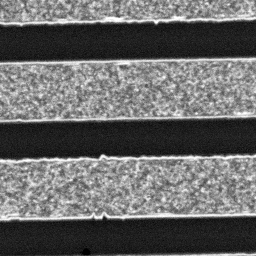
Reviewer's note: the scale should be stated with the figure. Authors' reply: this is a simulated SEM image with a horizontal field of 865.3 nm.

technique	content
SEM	one or a few lines or trenches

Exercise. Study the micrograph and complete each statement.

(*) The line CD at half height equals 0.195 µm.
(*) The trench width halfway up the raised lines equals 0.134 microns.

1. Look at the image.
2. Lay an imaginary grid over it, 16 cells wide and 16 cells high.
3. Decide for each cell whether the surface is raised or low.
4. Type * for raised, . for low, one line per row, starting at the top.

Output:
****************
................
................
................
****************
****************
****************
***.*...........
................
................
****************
****************
****************
************....
................
................